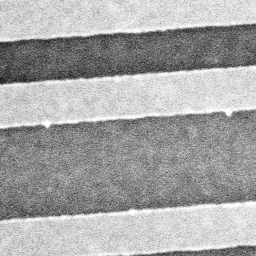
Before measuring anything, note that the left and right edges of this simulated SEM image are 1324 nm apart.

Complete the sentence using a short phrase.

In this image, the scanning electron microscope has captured lines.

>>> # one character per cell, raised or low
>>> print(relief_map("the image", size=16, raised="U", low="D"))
UUUUUUUUUUUUUUUU
UUUUUUUUUUUUUUUD
UDDDDDDDDDDDDDDD
DDDDDDDDDDDDDDDD
DDDDDDDDDDDUUUUU
UUUUUUUUUUUUUUUU
UUUUUUUUUUUUUUUU
UUUUUUDDDDDDDDDD
DDDDDDDDDDDDDDDD
DDDDDDDDDDDDDDDD
DDDDDDDDDDDDDDDD
DDDDDDDDDDDDDDDD
DDDDDDDDDDDDDDDD
DDDDUUUUUUUUUUUU
UUUUUUUUUUUUUUUU
UUUUUUUUUUUUUUDD